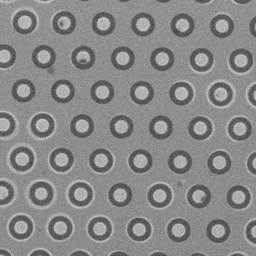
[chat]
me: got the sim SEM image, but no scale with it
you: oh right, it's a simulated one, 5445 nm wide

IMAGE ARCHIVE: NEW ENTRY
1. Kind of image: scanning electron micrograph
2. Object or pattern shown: an array of small figures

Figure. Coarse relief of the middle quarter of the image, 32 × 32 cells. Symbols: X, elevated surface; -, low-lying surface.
XX-----XXXXX-----XXXXX-----XXXXX
XXXX-XXXXXXXXX--XXXXXXX---XXXXXX
XXXXXXXXXXXXXXXXXXXXXXXXXXXXXXXX
XXXXXXXXXXXXXXXXXXXXXXXXXXXXXXXX
--XXXXXX---XXXXXXX---XXXXXXX---X
--XXXXX-----XXXXX-----XXXXX-----
---XXX-------XXX------XXXX------
---XXX-------XXX-------XXX------
--XXXXX-----XXXXX-----XXXX------
-XXXXXXX---XXXXXX----XXXXXX-----
XXXXXXXXXXXXXXXXXXXXXXXXXXXXX-XX
XXXXXXXXXXXXXXXXXXXXXXXXXXXXXXXX
XXXX-XXXXXXXXX-XXXXXXXXXXXXXXXXX
XX-----XXXXX-----XXXXX----XXXXXX
XX-----XXXXX-----XXXXX-----XXXX-
X-------XXX------XXXX------XXXX-
XX-----XXXX------XXXX------XXXX-
XX-----XXXXX-----XXXXX-----XXXX-
XXXX-XXXXXXXX---XXXXXXX---XXXXXX
XXXXXXXXXXXXXXXXXXXXXXXXXXXXXXXX
XXXXXXXXXXXXXXXXXXXXXXXXXXXXXXXX
-XXXXXXX---XXXXXXX--XXXXXXXX--XX
--XXXXX-----XXXXX-----XXXXX----X
--XXXX------XXXX------XXXX------
--XXXX-------XXX------XXXX------
--XXXX------XXXX------XXXX------
-XXXXXX----XXXXXX----XXXXXX----X
XXXXXXXXXXXXXXXXXXXXXXXXXXXX--XX
XXXXXXXXXXXXXXXXXXXXXXXXXXXXXXXX
XXX--XXXXXXXXXXXXXXXXXXXXXXXXXXX
X------XXXXX----XXXXXX----XXXXXX
X------XXXX------XXXX------XXXX-